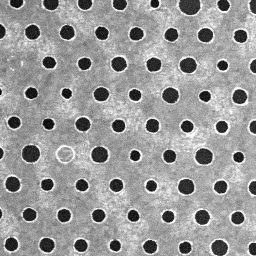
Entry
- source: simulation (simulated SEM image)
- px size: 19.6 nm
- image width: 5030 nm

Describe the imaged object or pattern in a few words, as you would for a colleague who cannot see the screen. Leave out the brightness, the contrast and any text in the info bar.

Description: a regular array of holes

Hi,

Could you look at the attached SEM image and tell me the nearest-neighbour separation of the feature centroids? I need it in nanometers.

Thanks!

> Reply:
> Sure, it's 673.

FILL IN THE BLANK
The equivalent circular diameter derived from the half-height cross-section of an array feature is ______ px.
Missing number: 14.1